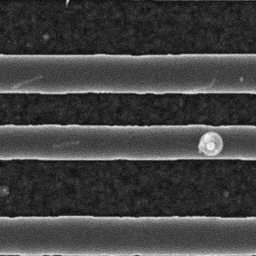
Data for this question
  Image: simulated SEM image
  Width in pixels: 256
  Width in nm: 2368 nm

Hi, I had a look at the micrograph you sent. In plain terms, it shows lines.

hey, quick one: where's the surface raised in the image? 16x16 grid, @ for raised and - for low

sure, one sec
----------------
----------------
----------------
@@@@@@@@@@@@@@@@
@@@@@@@@@@@@@@@@
@@@@@@@@@@@@@@@@
----------------
----------------
@@@@@@@@@@@@@@@@
@@@@@@@@@@@@@@@@
----------------
----------------
----------------
----------------
@@@@@@@@@@@@@@@@
@@@@@@@@@@@@@@@@